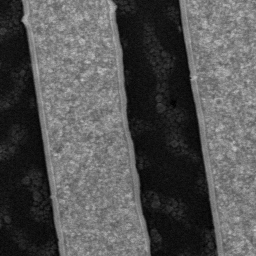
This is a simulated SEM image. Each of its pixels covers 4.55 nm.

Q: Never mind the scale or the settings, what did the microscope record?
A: one or a few lines or trenches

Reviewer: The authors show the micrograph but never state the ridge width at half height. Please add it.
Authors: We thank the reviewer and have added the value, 380 nm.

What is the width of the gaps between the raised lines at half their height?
329 nm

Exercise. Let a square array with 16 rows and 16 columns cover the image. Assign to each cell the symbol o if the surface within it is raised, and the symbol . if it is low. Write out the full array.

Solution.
..ooooo....ooooo
..ooooo.....oooo
..ooooo.....oooo
..ooooo.....oooo
..oooooo....oooo
..oooooo....oooo
...ooooo....oooo
...ooooo.....ooo
...ooooo.....ooo
...ooooo.....ooo
...ooooo.....ooo
...oooooo....ooo
...oooooo....ooo
....ooooo....ooo
....ooooo.....oo
....ooooo.....oo